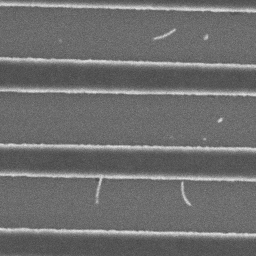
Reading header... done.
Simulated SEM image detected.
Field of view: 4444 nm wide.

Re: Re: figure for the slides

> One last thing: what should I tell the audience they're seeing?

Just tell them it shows lines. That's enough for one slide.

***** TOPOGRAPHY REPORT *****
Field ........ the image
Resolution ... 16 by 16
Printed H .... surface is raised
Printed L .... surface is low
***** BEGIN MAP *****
LLLLLLLHHHHHHHHH
LLLLLLLLLLLLLLLL
LLLLLLLLLLLLLLLL
LLLLLLLLLLLLLLLL
HHHHHHHHHHHHHHHH
HHHHHHHHHHHHHHHH
LLLLLLLLLLLLLLLL
LLLLLLLLLLLLLLLL
LLLLLLLLLLLLLLLL
HHHHHHHHHHHHHHHH
HHHHHHHHHHHHHHHH
LLLLLLLLLLLLLLLL
LLLLLLLLLLLLLLLL
LLLLLLLLLLLLLLLL
HHHHHHHHLLLLLLLL
HHHHHHHHHHHHHHHH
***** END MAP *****